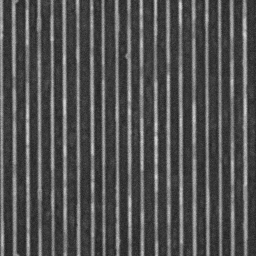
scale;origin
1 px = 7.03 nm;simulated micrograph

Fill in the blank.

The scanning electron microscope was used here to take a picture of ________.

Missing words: parallel lines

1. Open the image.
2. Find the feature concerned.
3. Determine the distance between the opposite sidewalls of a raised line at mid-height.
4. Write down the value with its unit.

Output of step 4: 20.2 nanometres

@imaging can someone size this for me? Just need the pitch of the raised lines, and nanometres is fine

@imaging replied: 90.2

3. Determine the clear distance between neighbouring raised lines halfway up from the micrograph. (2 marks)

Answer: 0.0729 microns